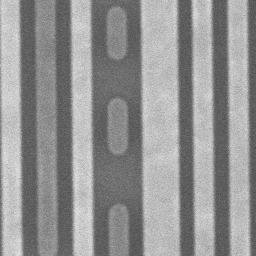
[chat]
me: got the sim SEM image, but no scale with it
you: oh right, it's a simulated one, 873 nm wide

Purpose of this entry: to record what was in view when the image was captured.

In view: groups of lines, slits or small figures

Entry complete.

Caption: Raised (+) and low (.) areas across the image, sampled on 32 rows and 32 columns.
++...++..++.......++++..++...++.
++...++..++...+...++++..++...++.
++...++..++..+++..++++..++...++.
++...++..++..+++..++++..++...++.
++...++..++..+++..++++..++...++.
++...++..++..+++..++++..++...++.
++...++..++...++..++++..++...++.
++...++..++.......++++..++...++.
++...++..++.......++++..++...++.
++...++..++.......++++..++...++.
++...++..++.......++++..++...++.
++...++..++.......++++..++...++.
++...++..++...+...++++..++...++.
++...++..++...++..++++..++...++.
++...++..++...++..++++..++...++.
++...++..++...++..++++..++...++.
++...++..++...++..++++..+++..++.
++...++..++...++..++++..+++..++.
++...++..++...++..++++..+++..++.
++...++..++.......++++..+++..++.
++...++..++.......++++..+++..++.
++...++..++.......++++..+++..++.
++...++..++.......++++..+++..++.
++...++..++.......++++..+++..++.
++...++..++.......++++..+++..++.
+++..++..++.......++++..+++..++.
+++..++..++...++..++++..+++..++.
+++..++..+++..++..++++..+++..++.
+++..++..+++..++..++++..+++..++.
+++..++..+++..++..++++..+++..++.
+++..++..+++..++..++++..+++..++.
+++..++..+++..++..++++..+++..++.